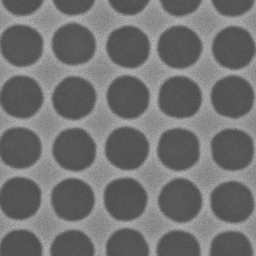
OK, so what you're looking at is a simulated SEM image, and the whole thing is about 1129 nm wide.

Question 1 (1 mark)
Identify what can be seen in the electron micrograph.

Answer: a regular array of holes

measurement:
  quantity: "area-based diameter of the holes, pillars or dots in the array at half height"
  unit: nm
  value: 194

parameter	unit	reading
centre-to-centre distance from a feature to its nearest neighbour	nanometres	224